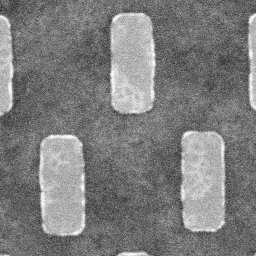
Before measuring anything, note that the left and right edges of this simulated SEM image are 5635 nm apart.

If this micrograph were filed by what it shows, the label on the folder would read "raised bodies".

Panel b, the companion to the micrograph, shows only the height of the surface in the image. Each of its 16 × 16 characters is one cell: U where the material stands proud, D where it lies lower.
DDDDDDDDDDDDDDDD
DDDDDDDUUDDDDDDD
UDDDDDDUUUDDDDDD
UDDDDDDUUUDDDDDD
UDDDDDDUUUDDDDDD
UDDDDDDUUUDDDDDD
UDDDDDDUUDDDDDDD
DDDDDDDDDDDDDDDD
DDDDDDDDDDDDUUDD
DDDUUDDDDDDUUUDD
DDUUUDDDDDDUUUDD
DDDUUDDDDDDUUUDD
DDDUUDDDDDDUUUDD
DDDUUDDDDDDDUUDD
DDDUUDDDDDDDDDDD
DDDDDDDDDDDDDDDD